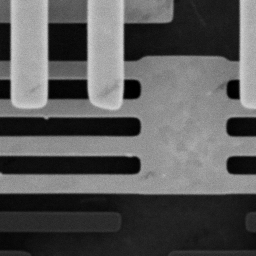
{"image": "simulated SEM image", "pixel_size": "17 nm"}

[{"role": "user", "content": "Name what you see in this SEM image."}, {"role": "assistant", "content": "wiring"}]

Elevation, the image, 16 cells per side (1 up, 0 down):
0110001100000001
0110001100000001
0110001100000001
0110001100000001
0110001100000001
0110001100000001
0110001000000001
0000000000000000
0000000000000000
0000000000000000
0000000000000000
0000000000000000
0000000000000000
0000000000000000
0000000000000000
0000000000000000